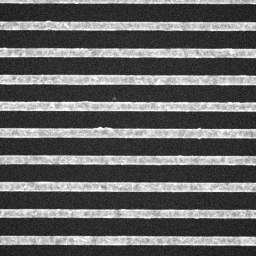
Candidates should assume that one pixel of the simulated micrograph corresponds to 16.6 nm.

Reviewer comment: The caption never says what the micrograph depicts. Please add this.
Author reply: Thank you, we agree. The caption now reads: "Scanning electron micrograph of parallel lines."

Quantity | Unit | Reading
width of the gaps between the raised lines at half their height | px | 18.2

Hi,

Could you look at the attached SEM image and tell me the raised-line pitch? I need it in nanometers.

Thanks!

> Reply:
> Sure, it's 445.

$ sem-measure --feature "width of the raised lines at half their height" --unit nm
139